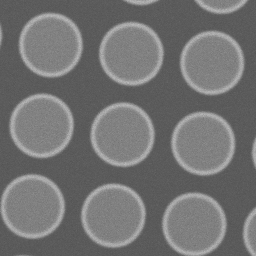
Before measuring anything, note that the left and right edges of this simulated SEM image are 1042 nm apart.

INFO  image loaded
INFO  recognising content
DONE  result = an array of small figures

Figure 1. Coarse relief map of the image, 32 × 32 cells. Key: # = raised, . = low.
.................##......######.
..........................###...
....#####.......................
...#######....#####.............
...#######...#######....#####...
..########...#######...#######..
..########..########...#######..
...#######..########...#######..
....#####....#######...#######..
.....##.......#####....#######..
...............###......######..
.........................###....
...#####........................
..#######....####...............
.########...#######....####.....
.########...#######...#######...
.########..########...#######...
..#######..########..########...
..######....#######...#######...
....###.....######....#######...
..............###.....#######...
........................###.....
..####..........................
.######.....####................
########...######......###......
########..########...######.....
########..########...#######...#
########..########..########...#
.######....#######..########..##
..####.....######....#######..##
............####.....######....#
......................####.....#